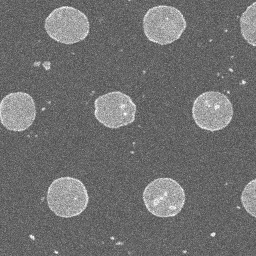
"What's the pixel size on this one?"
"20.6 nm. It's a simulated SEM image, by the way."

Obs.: raised bodies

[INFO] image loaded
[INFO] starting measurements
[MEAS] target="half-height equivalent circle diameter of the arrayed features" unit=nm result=819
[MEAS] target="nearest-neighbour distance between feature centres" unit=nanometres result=1990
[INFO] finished